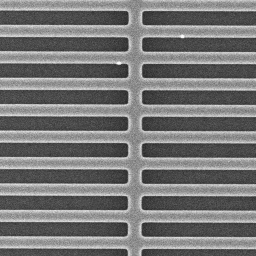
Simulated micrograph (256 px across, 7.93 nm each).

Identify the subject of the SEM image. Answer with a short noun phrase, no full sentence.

groups of lines, slits or small figures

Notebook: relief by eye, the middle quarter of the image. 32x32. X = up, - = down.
----------------XXXX------------
----------------XXX-------------
----------------XXX-------------
---------------XXXXX------------
XXXXXXXXXXXXXXXXXXXXXXXXXXXXXXXX
XXXXXXXXXXXXXXXXXXXXXXXXXXXXXXXX
---------------XXXXX------------
----------------XXX-------------
----------------XXX-------------
----------------XXXX------------
XXXXXXXXXXXXXXXXXXXXXXXXXXXXXXXX
XXXXXXXXXXXXXXXXXXXXXXXXXXXXXXXX
XXXXXXXXXXXXXXXXXXXXXXXXXXXXXXXX
----------------XXXX------------
----------------XXX-------------
----------------XXX-------------
----------------XXXX------------
XXXXXXXXXXXXXXXXXXXXXXXXXXXXXXXX
XXXXXXXXXXXXXXXXXXXXXXXXXXXXXXXX
XXXXXXXXXXXXXXXXXXXXXXXXXXXXXXXX
----------------XXX-------------
----------------XXX-------------
----------------XXX-------------
XX-------------XXXXX------------
XXXXXXXXXXXXXXXXXXXXXXXXXXXXXXXX
XXXXXXXXXXXXXXXXXXXXXXXXXXXXXXXX
---------------XXXXX------------
----------------XXX-------------
----------------XXX-------------
----------------XXXX------------
XXXXXXXXXXXXXXXXXXXXXXXXXXXXXXXX
XXXXXXXXXXXXXXXXXXXXXXXXXXXXXXXX